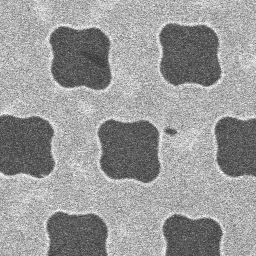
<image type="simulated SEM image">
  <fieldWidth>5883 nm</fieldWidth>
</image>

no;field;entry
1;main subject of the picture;holes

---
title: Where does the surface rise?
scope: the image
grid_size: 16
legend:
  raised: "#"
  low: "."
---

################
################
###....###....##
###....###....##
###....###....##
####...#########
################
...###########..
...###....###...
...###....###...
...###....####..
################
################
###...#####.####
###....###....##
###....###....##